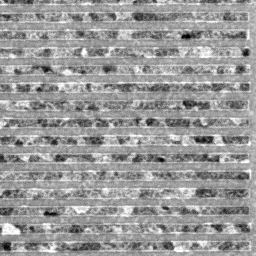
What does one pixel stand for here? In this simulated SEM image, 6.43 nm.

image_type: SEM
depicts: parallel lines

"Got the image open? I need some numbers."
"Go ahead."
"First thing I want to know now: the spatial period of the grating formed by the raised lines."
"113 nm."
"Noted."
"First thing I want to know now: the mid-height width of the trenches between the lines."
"53.9 nanometres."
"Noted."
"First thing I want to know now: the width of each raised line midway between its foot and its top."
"61.1 nm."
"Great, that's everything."